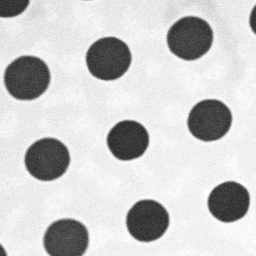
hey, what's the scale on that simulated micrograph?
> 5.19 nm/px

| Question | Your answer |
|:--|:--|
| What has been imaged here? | a regular array of holes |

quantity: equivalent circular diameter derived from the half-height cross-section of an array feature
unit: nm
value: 228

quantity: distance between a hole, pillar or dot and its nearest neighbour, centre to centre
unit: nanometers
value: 434